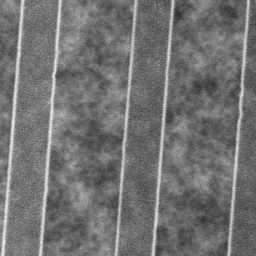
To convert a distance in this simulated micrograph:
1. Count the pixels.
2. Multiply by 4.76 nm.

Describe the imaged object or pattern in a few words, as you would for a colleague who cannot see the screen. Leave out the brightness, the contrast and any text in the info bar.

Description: one or a few lines or trenches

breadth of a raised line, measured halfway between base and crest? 181 nm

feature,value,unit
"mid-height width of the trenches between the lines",0.355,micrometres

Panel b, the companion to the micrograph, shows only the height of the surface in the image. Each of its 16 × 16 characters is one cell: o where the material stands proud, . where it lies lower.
.ooo....ooo.....
.ooo....ooo....o
.ooo....ooo....o
.ooo....ooo....o
.oo.....oo.....o
.oo.....oo.....o
.oo.....oo.....o
.oo.....oo.....o
.oo.....oo.....o
.oo.....oo.....o
.oo.....oo.....o
.oo.....oo.....o
ooo....ooo.....o
ooo....ooo....oo
ooo....ooo....oo
ooo....ooo....oo